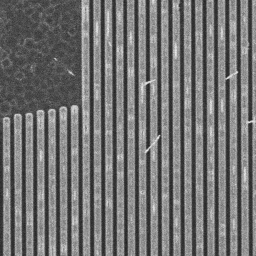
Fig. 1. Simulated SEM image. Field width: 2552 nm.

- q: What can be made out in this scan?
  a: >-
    parallel lines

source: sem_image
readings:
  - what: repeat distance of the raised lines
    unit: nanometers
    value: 113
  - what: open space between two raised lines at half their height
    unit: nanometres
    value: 43.6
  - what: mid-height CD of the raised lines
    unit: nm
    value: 69.8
